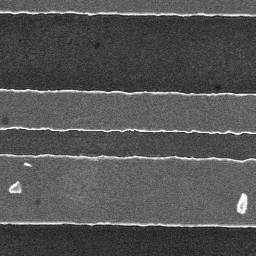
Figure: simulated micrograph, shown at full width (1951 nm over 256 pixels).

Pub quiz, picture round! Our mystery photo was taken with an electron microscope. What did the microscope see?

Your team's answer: lines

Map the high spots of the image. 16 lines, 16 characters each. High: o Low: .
oooooooooooooooo
................
................
................
................
................
oooooooooooooooo
oooooooooooooooo
oooooooooooooooo
oooooooooooooooo
oooooooooooooooo
oooooooooooooooo
oooooooooooooooo
oooooooooooooooo
................
................